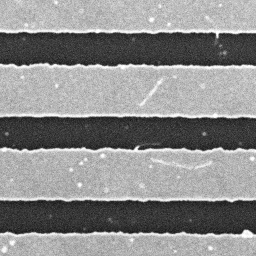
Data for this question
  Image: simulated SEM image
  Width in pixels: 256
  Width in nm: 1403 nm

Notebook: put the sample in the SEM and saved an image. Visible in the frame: lines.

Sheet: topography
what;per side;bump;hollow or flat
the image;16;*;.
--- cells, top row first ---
****************
****************
................
................
****************
****************
****************
................
................
****************
****************
****************
****************
................
................
****************